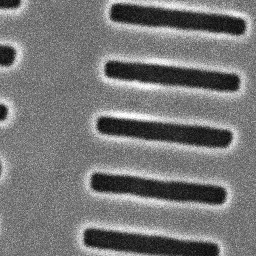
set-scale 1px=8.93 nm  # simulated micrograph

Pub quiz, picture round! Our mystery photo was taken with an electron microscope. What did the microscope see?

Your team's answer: holes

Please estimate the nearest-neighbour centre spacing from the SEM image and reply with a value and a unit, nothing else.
0.506 µm